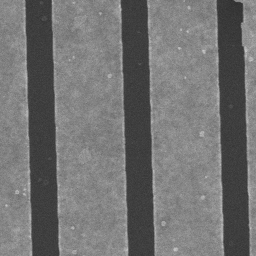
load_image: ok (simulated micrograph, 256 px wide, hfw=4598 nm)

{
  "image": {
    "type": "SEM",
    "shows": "lines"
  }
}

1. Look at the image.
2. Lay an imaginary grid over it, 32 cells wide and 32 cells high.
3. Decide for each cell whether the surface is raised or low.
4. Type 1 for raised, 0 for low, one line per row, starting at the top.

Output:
11100001111111100011111111100011
11100001111111100001111111100011
11100001111111100001111111100011
11100001111111100001111111100011
11100001111111100001111111100011
11100001111111100001111111100011
11100001111111100001111111100001
11100001111111100001111111100001
11100001111111100001111111100001
11100001111111100001111111100001
11100001111111100001111111100001
11100001111111100001111111100001
11100001111111100001111111100001
11100001111111100001111111100001
11100001111111100001111111100001
11100001111111100001111111100001
11100001111111100001111111100001
11110001111111110001111111100001
11110001111111110001111111110001
11110001111111110001111111110001
11110001111111110001111111110001
11110001111111110001111111110001
11110001111111110001111111110001
11110001111111110001111111110001
11110001111111110001111111110001
11110001111111110001111111110001
11110001111111110001111111110001
11110001111111110001111111110001
11110001111111110001111111110001
11110001111111110001111111110001
11110001111111110001111111110001
11110001111111110001111111110001